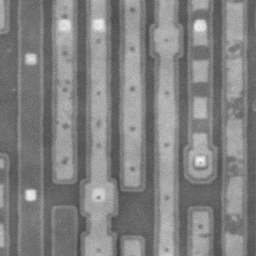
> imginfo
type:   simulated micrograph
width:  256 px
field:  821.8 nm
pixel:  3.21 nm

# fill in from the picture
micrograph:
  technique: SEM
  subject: wiring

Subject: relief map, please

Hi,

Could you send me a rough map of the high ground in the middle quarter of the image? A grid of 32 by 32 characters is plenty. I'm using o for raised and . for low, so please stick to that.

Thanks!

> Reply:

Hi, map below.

ooo...ooooo...oooooo...oooooo..o
ooo...ooooo...oooooo...oooooo..o
ooo...ooooo...oooooo...oooooo..o
ooo...ooooo...oooooo...oooooo..o
ooo...ooooo...oooooo...oooooo..o
ooo...ooooo...oooooo...oooooo..o
ooo...ooooo...oooooo...oooooo..o
ooo...ooooo...oooooo...oooooo..o
ooo...oooooo..oooooo...oooooo..o
ooo...oooooo..oooooo...oooooo..o
ooo...oooooo..oooooo...oooooo..o
ooo...oooooo..oooooo...oooooo..o
ooo...oooooo..oooooo...oooooo..o
ooo...ooooo...oooooo...oooooo..o
ooo...oooooo..oooooo...oooooo..o
ooo...oooooo..oooooo...oooooo..o
ooo...oooooo..oooooo...oooooo..o
ooo...oooooo..oooooo...oooooo..o
ooo...oooooo..oooooo...oooooo..o
ooo...oooooo..oooooo...oooooo..o
ooo...oooooo..oooooo...oooooo..o
ooo...ooooo...oooooo...ooooo..oo
ooo...ooooo...oooooo...ooooo..oo
ooo...ooooo...oooooo...ooooo..oo
ooo...oooooo..oooooo...ooooo..oo
ooo...oooooo..oooooo...ooooo..oo
ooo...oooooo..oooooo...ooooo..oo
ooo...oooooo..oooooo...ooooo..oo
ooo..ooooooo..oooooo...ooooo...o
ooo.oooooooooooooooo...ooooo....
....oooooooooooooooo...ooooo....
....ooooooooo.oooooo...ooooo....